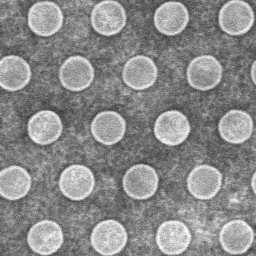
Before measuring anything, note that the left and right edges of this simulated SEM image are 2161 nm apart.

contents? a regular array of raised bodies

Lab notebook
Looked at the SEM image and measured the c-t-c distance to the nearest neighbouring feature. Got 0.53 µm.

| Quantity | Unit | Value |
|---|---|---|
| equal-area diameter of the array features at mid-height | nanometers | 283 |